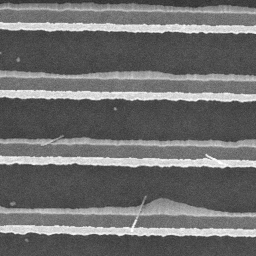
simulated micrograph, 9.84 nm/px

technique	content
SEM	lines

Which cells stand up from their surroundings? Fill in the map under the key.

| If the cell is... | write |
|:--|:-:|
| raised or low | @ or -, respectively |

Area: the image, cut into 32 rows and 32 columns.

--------------------------------
@@@@@@@@@@@@@@@@@@@@@@@@@@@@@@@@
@@@@@@@@@@@@@@@@@@@@@@@@@@@@@@@@
@@@@@@@@@@@@@@@@@@@@@@@@@@@@@@@@
--------------------------------
--------------------------------
--------------------------------
--------------------------------
--------------------------------
@@@@@@--------@@@-@-------------
@@@@@@@@@@@@@@@@@@@@@@@@@@@@@@@@
@@@@@@@@@@@@@@@@@@@@@@@@@@@@@@@@
-----------------------@@--@@@@@
--------------------------------
--------------------------------
--------------------------------
--------------------------------
--------------------------------
@@@@@@@@@@@@@@@@@@@@@@@@@@@@@@@@
@@@@@@@@@@@@@@@@@@@@@@@@@@@@@@@@
----@@-----@@@@@@@@@@@@@@@@@@@@@
--------------------------------
--------------------------------
--------------------------------
--------------------------------
--------------------------------
@@@@@@@@@@@@@@@@@@@@@@@@--------
@@@@@@@@@@@@@@@@@@@@@@@@@@@@@@@@
@@@@@@@@@@@@@@@@@@@@@@@@@@@@@@@@
--------------------------------
--------------------------------
--------------------------------